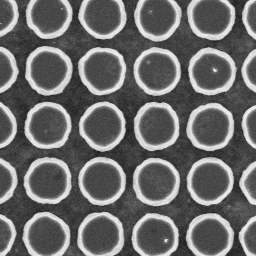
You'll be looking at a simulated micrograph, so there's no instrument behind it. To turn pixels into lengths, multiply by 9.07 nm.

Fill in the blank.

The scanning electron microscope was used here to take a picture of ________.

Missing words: a regular array of raised bodies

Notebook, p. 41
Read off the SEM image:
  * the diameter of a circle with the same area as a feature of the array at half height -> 397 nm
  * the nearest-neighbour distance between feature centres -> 489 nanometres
